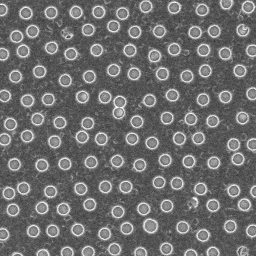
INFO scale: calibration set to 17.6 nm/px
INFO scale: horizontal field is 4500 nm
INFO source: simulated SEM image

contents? a regular array of holes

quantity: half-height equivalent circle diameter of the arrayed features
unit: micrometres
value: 0.184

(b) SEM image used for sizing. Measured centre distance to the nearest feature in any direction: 0.361 µm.